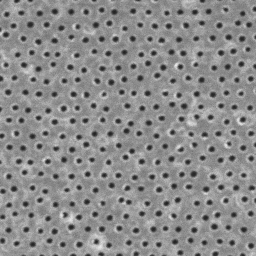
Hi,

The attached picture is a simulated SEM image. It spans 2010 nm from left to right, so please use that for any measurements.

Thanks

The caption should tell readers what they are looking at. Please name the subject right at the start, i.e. a regular array of holes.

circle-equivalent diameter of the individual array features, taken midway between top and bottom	0.0493	microns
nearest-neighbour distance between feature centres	13.2	px